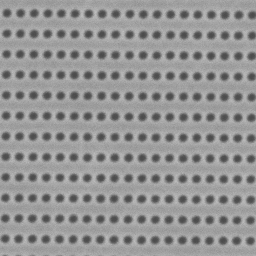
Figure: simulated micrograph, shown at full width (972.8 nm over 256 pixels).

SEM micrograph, a regular array of holes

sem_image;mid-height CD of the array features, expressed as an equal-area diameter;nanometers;34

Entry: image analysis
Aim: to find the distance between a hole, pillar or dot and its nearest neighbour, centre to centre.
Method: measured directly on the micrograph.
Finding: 13.4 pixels